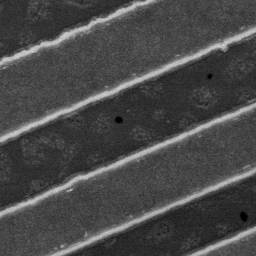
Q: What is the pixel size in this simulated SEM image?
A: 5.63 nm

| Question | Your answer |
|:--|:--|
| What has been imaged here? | one or a few lines or trenches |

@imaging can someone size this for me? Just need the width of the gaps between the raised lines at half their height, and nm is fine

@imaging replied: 381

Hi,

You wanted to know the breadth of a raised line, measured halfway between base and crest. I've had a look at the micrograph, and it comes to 348 nanometres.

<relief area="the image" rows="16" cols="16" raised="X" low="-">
--------XXXXXXXX
------XXXXXXXXXX
----XXXXXXXXXXX-
-XXXXXXXXXXX----
XXXXXXXXXX------
XXXXXXXX--------
XXXXX-----------
XXX-----------XX
X----------XXXXX
---------XXXXXXX
-------XXXXXXXXX
----XXXXXXXXXX--
--XXXXXXXXXX----
XXXXXXXXX-------
XXXXXXX--------X
XXXXX--------XXX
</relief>